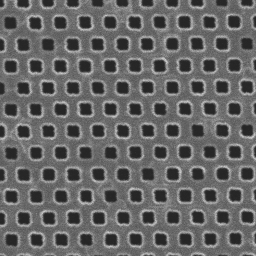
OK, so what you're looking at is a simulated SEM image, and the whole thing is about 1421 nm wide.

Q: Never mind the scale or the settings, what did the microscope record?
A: a regular array of holes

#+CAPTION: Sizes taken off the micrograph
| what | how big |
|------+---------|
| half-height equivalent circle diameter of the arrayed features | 72.5 nm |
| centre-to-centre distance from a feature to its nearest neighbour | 137 nanometres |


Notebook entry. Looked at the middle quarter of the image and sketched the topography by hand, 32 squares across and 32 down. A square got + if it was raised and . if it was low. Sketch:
.+++...+++...+++...+++...++++...
.+++...+++...+++...++++..++++...
++++++++++++++++++++++++++++++++
++++++++++++++++++++++++++++++++
+..++++..+++++.+++++..++++..++++
+...+++...+++...+++...+++....+++
+...+++...+++...+++...+++....+++
++++++++++++++++++++++++++++++++
++++++++++++++++++++++++++++++++
++++++++++++++++++++++++++++++++
.+++...+++...+++...+++....+++...
.+++...+++...+++...+++....+++...
.+++...+++...++++..++++..++++...
++++++++++++++++++++++++++++++++
++++++++++++++++++++++++++++++++
+..++++...++++..++++..++++...+++
+...+++...+++...+++...++++...+++
+...+++...+++...++++...+++...+++
++++++++++++++++++++++++++++++++
++++++++++++++++++++++++++++++++
++++++++++++++++++.++++++++++..+
.+++...+++...+++...+++....+++...
.+++...+++...+++...+++....+++...
++++...++++..++++..++++..++++..+
++++++++++++++++++++++++++++++++
++++++++++++++++++++++++++++++++
+...+++...+++...+++...++++...+++
+...+++...+++...+++....+++...+++
+...+++...+++...++++...+++...+++
++++++++++++++++++++++++++++++++
++++++++++++++++++++++++++++++++
+++++.+++++.+++++..++++..++++..+